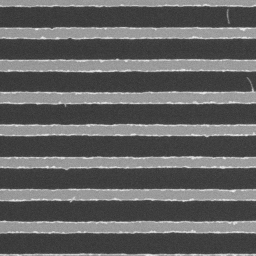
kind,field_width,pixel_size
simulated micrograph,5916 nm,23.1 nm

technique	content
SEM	parallel lines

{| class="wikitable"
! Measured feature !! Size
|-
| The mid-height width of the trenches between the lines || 491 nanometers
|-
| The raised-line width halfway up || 251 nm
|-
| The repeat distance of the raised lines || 0.748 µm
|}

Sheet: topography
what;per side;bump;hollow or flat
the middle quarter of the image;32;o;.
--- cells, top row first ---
oooooooooooooooooooooooooooooooo
oooooooooooooooooooooooooooooooo
................................
................................
................................
................................
................................
oooooooooooooooooooooooooooooooo
oooooooooooooooooooooooooooooooo
oooooooooooooooooooooooooooooooo
................................
................................
................................
................................
................................
oooooooooooooooooooooooooooooooo
oooooooooooooooooooooooooooooooo
oooooooooooooooooooooooooooooooo
................................
................................
................................
................................
................................
oooooooooooooooooooooooooooooooo
oooooooooooooooooooooooooooooooo
oooooooooooooooooooooooooooooooo
................................
................................
................................
................................
................................
oooooooo...o.o..o.....oo.o...ooo